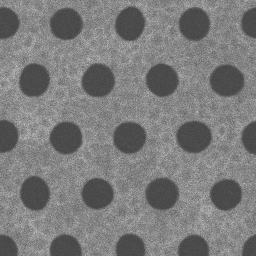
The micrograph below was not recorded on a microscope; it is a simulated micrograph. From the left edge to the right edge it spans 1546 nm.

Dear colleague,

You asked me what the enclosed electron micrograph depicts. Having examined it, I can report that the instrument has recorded a regular array of holes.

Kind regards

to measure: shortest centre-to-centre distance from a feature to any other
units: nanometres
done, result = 385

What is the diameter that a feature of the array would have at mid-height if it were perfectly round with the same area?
194 nm